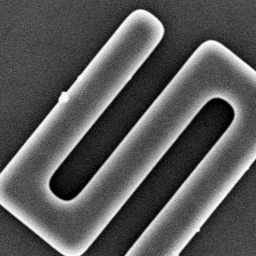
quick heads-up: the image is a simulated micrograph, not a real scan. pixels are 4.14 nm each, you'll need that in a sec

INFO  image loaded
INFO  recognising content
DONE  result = groups of lines, slits or small figures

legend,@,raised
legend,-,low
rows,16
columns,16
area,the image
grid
----------------
--------@@------
-------@@@------
------@@@---@@@-
-----@@@---@@@@@
----@@@@--@@@@@@
----@@@---@@@-@@
---@@@---@@@---@
--@@@---@@@---@@
-@@@---@@@---@@@
@@@@--@@@@--@@@-
@@@---@@@--@@@@-
@@@@@@@@---@@@--
-@@@@@@---@@@---
--@@@@---@@@----
---@@---@@@-----